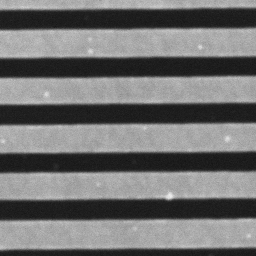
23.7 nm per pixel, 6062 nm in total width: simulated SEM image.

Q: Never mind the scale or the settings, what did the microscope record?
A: lines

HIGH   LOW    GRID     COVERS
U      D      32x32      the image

UUUUUUUUUUUUUUUUUUUUUUUUUUUUUUUU
DDDDDDDDDDDDDDDDDDDDDDDDDDDDDDDD
DDDDDDDDDDDDDDDDDDDDDDDDDDDDDDDD
DDDDDDDDDDDDDDDDDDDDDDDDDDDDDDDD
UUUUUUUUUUUUUUUUUUUUUUUUUUUUUUUU
UUUUUUUUUUUUUUUUUUUUUUUUUUUUUUUU
UUUUUUUUUUUUUUUUUUUUUUUUUUUUUUUU
DDDDDDDDDDDDDDDDDDDDDDDDDDDDDDDD
DDDDDDDDDDDDDDDDDDDDDDDDDDDDDDDD
DDDDDDDDDDDDDDDDDDDDDDDDDDDDDDDD
UUUUUUUUUUUUUUUUUUUUUUUUUUUUUUUU
UUUUUUUUUUUUUUUUUUUUUUUUUUUUUUUU
UUUUUUUUUUUUUUUUUUUUUUUUUUUUUUUU
DDDDDDDDDDDDDDDDDDDDDDDDDDDDDDDD
DDDDDDDDDDDDDDDDDDDDDDDDDDDDDDDD
DDDDDDDDDDDDDDDDDDDDDDDDDDDUUUUU
UUUUUUUUUUUUUUUUUUUUUUUUUUUUUUUU
UUUUUUUUUUUUUUUUUUUUUUUUUUUUUUUU
UUUUUUUUUUUUUUUUUUUUUUUUUUUUUUUU
DDDDDDDDDDDDDDDDDDDDDDDDDDDDDDDD
DDDDDDDDDDDDDDDDDDDDDDDDDDDDDDDD
DDDDDDDDDDDDDDDDDDDDDDDDDDDDUDDD
UUUUUUUUUUUUUUUUUUUUUUUUUUUUUUUU
UUUUUUUUUUUUUUUUUUUUUUUUUUUUUUUU
UUUUUUUUUUUUUUUUUUUUUUUUUUUUUUUU
DDDDDDDDDDDDDDDDDDDDDDDDDDDDDDDD
DDDDDDDDDDDDDDDDDDDDDDDDDDDDDDDD
DDDDDDDDDDDDDDDDDDDDDDDDDDDDDUUU
UUUUUUUUUUUUUUUUUUUUUUUUUUUUUUUU
UUUUUUUUUUUUUUUUUUUUUUUUUUUUUUUU
UUUUUUUUUUUUUUUUUUUUUUUUUUUUUUUU
DDDDDDDDDDDDDDDDDDDDDDDDDDDDDDDD